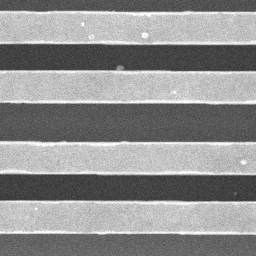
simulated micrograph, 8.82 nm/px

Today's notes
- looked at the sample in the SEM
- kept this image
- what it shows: lines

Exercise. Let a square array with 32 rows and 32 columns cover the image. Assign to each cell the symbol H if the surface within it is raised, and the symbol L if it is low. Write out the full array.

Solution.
LLLLLLLLLLLLLLLLLLLLLLLLLLLLLLLL
HHHLLLLHHHHHLLLLLLLLLLLLLLLLLLLL
HHHHHHHHHHHHHHHHHHHHHHHHHHHHHHHH
HHHHHHHHHHHHHHHHHHHHHHHHHHHHHHHH
HHHHHHHHHHHHHHHHHHHHHHHHHHHHHHHH
LLLLLLLLLLLLLLLLLHHLLLHHHHHHHHHH
LLLLLLLLLLLLLLLLLLLLLLLLLLLLLLLL
LLLLLLLLLLLLLLLLLLLLLLLLLLLLLLLL
LLLLLLLLLLLLLLLLLLLLLLLLLLLLLLLL
HHHHHHHHHHHHHHHHHHHHHHHHHHHHHHHH
HHHHHHHHHHHHHHHHHHHHHHHHHHHHHHHH
HHHHHHHHHHHHHHHHHHHHHHHHHHHHHHHH
HHHHHHHHHHHHHHHHHHHHHHHHHHHHHHHH
LLLLLLLLLLLLLLLLLLLLLLLLLLLLLLLL
LLLLLLLLLLLLLLLLLLLLLLLLLLLLLLLL
LLLLLLLLLLLLLLLLLLLLLLLLLLLLLLLL
LLLLLLLLLLLLLLLLLLLLLLLLLLLLLLLL
LLLLLLLLLLLLLLLLLLLLLLLLLLLLLLLL
HHHHHHHHHHHHHHHHHHHHHHHHHHHHHHHH
HHHHHHHHHHHHHHHHHHHHHHHHHHHHHHHH
HHHHHHHHHHHHHHHHHHHHHHHHHHHHHHHH
HHHHHHHHHHHHHHHHHHHHHHHHHHHHHHHH
LLLLLLLLLLLLLLLLLLLLLLLLLLLLLLLL
LLLLLLLLLLLLLLLLLLLLLLLLLLLLLLLL
LLLLLLLLLLLLLLLLLLLLLLLLLLLLLLLL
HHHHHHHHHHHHHHHHHHHHHHHHHHHHHHHH
HHHHHHHHHHHHHHHHHHHHHHHHHHHHHHHH
HHHHHHHHHHHHHHHHHHHHHHHHHHHHHHHH
HHHHHHHHHHHHHHHHHHHHHHHHHHHHHHHH
LLLLLLLLLLLLLLLLLLLLLLLLLLLLLLLL
LLLLLLLLLLLLLLLLLLLLLLLLLLLLLLLL
LLLLLLLLLLLLLLLLLLLLLLLLLLLLLLLL